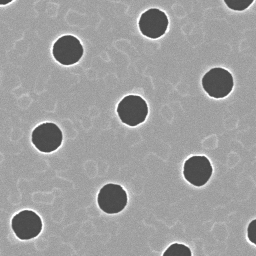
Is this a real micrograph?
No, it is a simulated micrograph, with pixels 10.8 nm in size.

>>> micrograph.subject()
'a regular array of holes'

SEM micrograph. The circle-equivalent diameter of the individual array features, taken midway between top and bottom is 0.328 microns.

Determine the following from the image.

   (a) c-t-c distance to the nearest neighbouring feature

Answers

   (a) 88.5 px